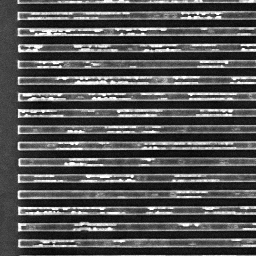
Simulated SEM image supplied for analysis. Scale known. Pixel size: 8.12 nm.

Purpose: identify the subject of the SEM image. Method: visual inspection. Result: parallel lines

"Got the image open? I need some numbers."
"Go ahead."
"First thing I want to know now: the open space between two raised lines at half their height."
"71 nanometers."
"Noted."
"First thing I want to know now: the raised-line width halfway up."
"62.9 nanometres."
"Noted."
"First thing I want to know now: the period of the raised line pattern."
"132 nanometres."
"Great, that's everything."